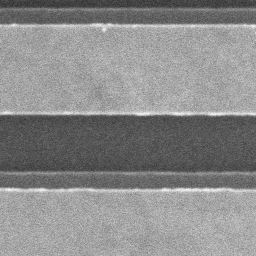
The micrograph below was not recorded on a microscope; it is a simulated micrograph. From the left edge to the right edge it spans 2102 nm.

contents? lines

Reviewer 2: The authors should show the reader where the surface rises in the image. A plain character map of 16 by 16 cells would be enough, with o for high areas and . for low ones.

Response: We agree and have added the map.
................
................
oooooooooooooooo
oooooooooooooooo
oooooooooooooooo
oooooooooooooooo
oooooooooooooooo
................
................
................
................
................
oooooooooooooooo
oooooooooooooooo
oooooooooooooooo
oooooooooooooooo